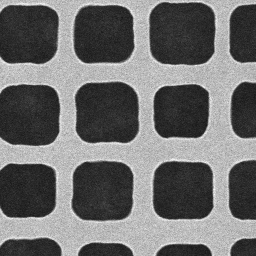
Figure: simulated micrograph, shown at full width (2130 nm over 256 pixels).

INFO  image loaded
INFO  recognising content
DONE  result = holes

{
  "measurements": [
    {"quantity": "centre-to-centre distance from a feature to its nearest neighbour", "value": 0.65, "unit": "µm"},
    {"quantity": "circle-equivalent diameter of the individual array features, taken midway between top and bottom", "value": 0.542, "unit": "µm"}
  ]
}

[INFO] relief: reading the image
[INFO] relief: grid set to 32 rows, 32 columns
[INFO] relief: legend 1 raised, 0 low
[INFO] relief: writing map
11111111111111111111000000111111
00000001110000001110000000011000
00000001100000000110000000011000
00000001100000000110000000011000
00000001100000000110000000011000
00000001100000000110000000011000
00000001100000000110000000011000
00000011110000001110000000111000
11111111111111111111111111111111
11111111111111111111111111111111
11111111111000001111111011111100
00000001110000000111000000111000
00000001100000000110000000111000
00000000110000000110000000111000
00000001110000000110000000111000
00000001100000000110000000111000
00000001110000000111000000111000
00000001110000001111111111111111
11111111111111111111111111111111
11111111111111111111111111111111
10000111110000001111000000111000
00000001100000000110000000011000
00000001100000000110000000010000
00000001100000000110000000010000
00000001100000000110000000011000
00000001100000000110000000011000
00000011100000001110000000111000
11111111111000011111111111111100
11111111111111111111111111111111
11111111111111111111111111111111
00000001111000011111110111111000
00000000110000000111000000111000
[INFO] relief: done